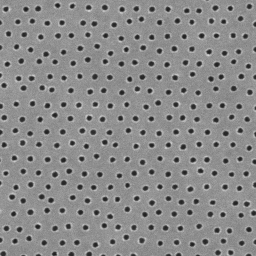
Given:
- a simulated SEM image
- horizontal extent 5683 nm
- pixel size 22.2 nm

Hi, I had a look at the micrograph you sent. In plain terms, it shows a regular array of holes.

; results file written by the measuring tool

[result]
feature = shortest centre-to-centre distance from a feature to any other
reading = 298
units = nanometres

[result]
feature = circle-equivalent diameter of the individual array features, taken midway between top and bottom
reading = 0.125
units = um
